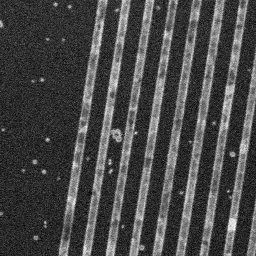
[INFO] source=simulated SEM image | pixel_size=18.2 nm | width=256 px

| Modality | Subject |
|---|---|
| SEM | parallel lines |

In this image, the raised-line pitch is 423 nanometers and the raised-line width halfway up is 0.126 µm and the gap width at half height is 294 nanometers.